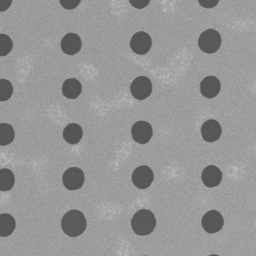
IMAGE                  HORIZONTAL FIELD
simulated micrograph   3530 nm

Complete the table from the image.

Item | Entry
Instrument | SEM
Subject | a regular array of holes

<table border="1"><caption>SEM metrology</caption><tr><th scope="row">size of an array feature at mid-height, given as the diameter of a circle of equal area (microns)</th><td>0.312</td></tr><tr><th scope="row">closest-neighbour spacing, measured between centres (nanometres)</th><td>617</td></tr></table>